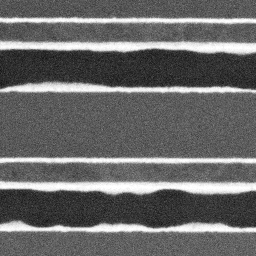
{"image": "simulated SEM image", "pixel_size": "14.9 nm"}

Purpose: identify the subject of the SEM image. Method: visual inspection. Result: lines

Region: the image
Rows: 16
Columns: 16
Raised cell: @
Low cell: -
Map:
@@@@@@@@@@@@@@@@
@@@@@@@@@@@@@@@@
@@@@@@@@@@@@@@@@
----------------
----------------
----------------
@@@@@@@@@@@@@@@@
@@@@@@@@@@@@@@@@
@@@@@@@@@@@@@@@@
@@@@@@@@@@@@@@@@
@@@@@@@@@@@@@@@@
@@@@@@@@@@@@@@@@
----------------
----------------
@@@@@@@@@@@@@@@@
@@@@@@@@@@@@@@@@